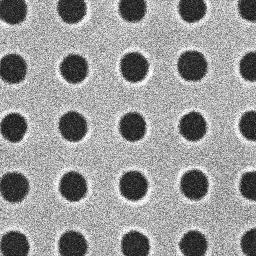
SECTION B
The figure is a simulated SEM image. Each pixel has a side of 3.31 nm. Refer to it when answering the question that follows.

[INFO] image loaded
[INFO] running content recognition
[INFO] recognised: a regular array of holes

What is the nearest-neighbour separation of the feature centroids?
58.5 pixels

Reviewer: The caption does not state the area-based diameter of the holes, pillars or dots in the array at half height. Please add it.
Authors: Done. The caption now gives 98.4 nm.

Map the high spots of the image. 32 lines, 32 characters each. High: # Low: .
...####....####...####....####..
...####....####...####....####..
...#####..######..#####..######.
################################
################################
################################
#######################..######.
...#####...####...####....####..
...####....####....###....####..
...#####...####...#####...####..
#########.######################
################################
################################
################################
#..#####..#####...#####..#####..
...####....####...####....####..
...####....####...#####...####..
#..#####..######.######..######.
################################
################################
################################
#########.######.######..######.
...####....####...#####...####..
....###....####...#####...####..
...#####...####...#####...####..
################################
################################
################################
################################
...#####..#####...#####...####..
....###....####....###....####..
....###....####....####...####..